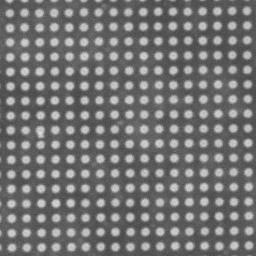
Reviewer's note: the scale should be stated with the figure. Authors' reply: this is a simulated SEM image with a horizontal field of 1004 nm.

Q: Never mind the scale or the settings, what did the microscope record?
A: a regular array of raised bodies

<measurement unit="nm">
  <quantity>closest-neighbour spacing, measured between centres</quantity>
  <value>55.9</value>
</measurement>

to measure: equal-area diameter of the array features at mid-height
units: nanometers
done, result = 28.3